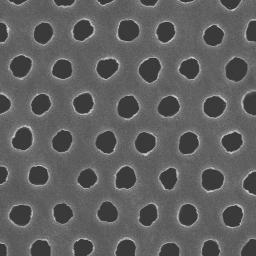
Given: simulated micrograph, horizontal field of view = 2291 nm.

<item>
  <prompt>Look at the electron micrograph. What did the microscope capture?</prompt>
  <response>a regular array of holes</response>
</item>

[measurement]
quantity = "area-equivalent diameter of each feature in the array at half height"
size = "182 nm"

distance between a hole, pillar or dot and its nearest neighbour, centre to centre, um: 0.355